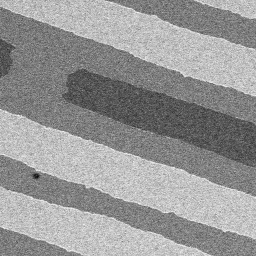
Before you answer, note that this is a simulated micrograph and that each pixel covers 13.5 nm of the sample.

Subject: one or a few lines or trenches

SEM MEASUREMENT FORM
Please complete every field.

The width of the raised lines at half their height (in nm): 565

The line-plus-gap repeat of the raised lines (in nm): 929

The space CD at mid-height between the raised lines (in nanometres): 372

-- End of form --